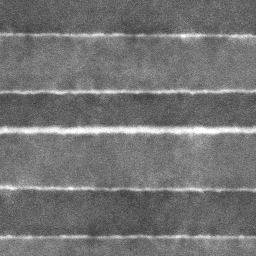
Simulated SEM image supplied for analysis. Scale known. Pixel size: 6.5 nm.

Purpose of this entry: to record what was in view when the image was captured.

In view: lines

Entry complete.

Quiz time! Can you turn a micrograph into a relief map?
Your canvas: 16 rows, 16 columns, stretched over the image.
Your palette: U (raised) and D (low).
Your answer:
DDDDDDDDDDDDDDDD
DDDDDDDDDDDDDDDD
UUUUUUUUUUUUUUUU
UUUUUUUUUUUUUUUU
UUUUUUUUUUUUUUUU
UUUUUUUUUUUUUUUU
DDDDDDDDDDDDDDDD
DDDDDDDDDDDDDDDD
UUUUUUUUUUUUUUUU
UUUUUUUUUUUUUUUU
UUUUUUUUUUUUUUUU
UUUUUUUUUUUUUUUU
DDDDDDDDDDDDDDDD
DDDDDDDDDDDDDDDD
DDDDDDDDDDDDDDDD
UUUUUUUUUUUUUUUU